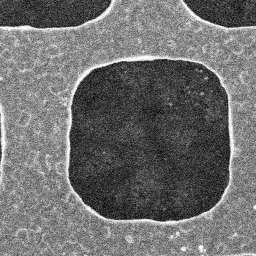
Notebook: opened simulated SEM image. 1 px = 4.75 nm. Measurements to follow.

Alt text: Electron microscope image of holes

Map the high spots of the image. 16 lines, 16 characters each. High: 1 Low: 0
0000000111110000
0000011111111000
1111111111111111
1111111111111111
1111110000000111
1111100000000011
1111000000000011
1111000000000011
1111000000000011
1111000000000011
1111000000000011
1111000000000011
1111100000000011
1111110000001111
1111111111111111
1111111111111111